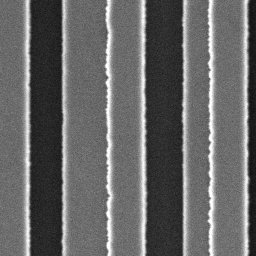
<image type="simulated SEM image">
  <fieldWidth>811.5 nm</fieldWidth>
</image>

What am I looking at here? lines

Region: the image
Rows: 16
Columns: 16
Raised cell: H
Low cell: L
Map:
HHLLHHHHHLLLHHHL
HHLLHHHHHLLHHHHL
HHLLHHHHHLLHHHHL
HHLLHHHHHLLLHHHL
HHLLHHHHHLLLHHHL
HHLLHHHHHLLLHHHL
HHLLHHHHHLLHHHHL
HHLLHHHHHLLHHHHL
HHLLHHHHHLLHHHHL
HHLLHHHHHLLHHHHL
HHLLHHHHHLLHHHHL
HHLLHHHHHLLHHHHL
HHLLHHHHHLLLHHHL
HHLLHHHHHLLHHHHL
HHLLHHHHHLLLHHHL
HHLLHHHHHLLLHHHL